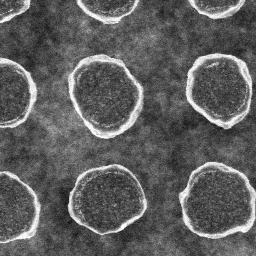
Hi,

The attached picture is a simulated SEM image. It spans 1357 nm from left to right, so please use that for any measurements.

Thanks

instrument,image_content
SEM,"raised bodies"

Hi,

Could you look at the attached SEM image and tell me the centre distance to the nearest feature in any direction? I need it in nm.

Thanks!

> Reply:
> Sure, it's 570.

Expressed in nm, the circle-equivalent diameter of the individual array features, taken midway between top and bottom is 378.